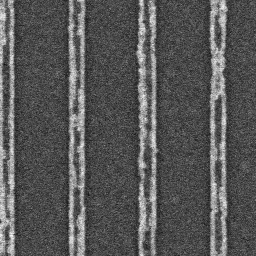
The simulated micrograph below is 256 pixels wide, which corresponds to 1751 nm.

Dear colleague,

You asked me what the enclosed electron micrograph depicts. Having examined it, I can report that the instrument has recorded one or a few lines or trenches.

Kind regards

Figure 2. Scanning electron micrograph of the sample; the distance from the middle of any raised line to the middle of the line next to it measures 483 nanometers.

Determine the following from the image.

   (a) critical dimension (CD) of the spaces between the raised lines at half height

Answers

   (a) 58.8 pixels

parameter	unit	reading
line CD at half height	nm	82